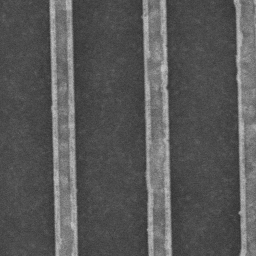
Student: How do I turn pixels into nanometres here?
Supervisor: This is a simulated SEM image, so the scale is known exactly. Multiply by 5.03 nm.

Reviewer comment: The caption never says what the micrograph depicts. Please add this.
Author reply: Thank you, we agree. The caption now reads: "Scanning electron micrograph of one or a few lines or trenches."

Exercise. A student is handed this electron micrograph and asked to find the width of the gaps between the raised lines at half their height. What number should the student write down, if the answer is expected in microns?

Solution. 0.37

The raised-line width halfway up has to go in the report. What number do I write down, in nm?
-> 97.4